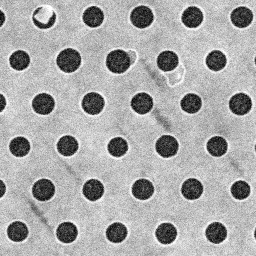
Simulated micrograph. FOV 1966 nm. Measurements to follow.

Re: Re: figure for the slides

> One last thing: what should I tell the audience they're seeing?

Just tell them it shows a regular array of holes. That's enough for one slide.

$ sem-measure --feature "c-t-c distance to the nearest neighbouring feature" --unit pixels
48.5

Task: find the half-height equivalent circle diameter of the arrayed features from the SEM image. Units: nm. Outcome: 173